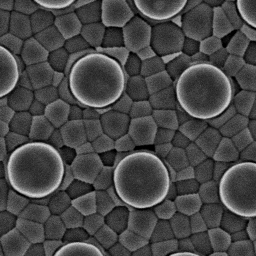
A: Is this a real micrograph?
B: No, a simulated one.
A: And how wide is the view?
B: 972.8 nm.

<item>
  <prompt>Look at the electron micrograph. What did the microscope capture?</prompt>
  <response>raised bodies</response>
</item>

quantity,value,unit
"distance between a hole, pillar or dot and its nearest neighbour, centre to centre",407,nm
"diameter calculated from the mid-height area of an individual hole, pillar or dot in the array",206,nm